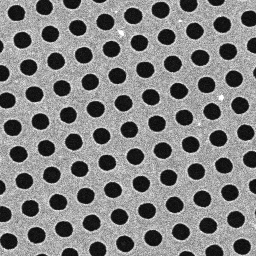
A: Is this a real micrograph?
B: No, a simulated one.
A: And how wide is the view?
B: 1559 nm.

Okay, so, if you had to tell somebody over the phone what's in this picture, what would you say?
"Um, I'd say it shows a regular array of holes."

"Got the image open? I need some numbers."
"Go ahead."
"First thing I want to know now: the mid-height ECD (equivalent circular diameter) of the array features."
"105 nm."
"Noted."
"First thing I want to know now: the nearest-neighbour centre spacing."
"0.168 µm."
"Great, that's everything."